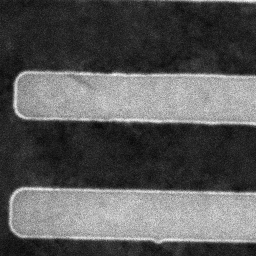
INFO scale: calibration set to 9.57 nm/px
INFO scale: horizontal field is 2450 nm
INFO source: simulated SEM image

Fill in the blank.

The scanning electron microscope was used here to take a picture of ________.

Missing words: one or a few lines or trenches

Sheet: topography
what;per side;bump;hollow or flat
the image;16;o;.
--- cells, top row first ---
oooooooooooooooo
oooooooooooooooo
oooooooooooooooo
oooooooooooooooo
oooooooooooooooo
o...............
o...............
oooooooo........
oooooooooooooooo
oooooooooooooooo
oooooooooooooooo
oooooooooooooooo
o...............
o...............
o...............
oooooooooooooooo